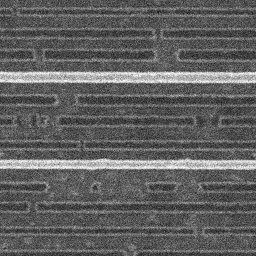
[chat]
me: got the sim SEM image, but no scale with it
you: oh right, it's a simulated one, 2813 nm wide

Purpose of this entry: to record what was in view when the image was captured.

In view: parallel lines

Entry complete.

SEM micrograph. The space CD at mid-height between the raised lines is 0.148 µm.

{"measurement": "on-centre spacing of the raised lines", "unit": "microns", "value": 0.241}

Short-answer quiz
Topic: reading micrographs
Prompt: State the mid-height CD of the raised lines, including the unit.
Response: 98.9 nm